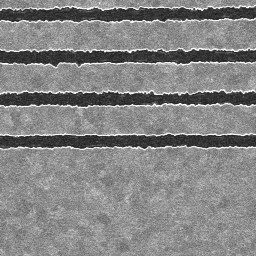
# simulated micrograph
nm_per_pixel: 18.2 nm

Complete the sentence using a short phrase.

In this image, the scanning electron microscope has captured parallel lines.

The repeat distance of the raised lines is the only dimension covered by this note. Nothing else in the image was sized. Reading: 774 nm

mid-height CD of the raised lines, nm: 538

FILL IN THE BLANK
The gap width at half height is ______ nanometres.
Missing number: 230